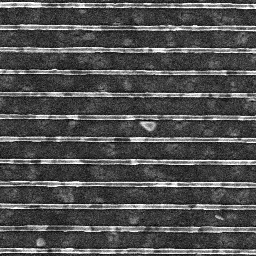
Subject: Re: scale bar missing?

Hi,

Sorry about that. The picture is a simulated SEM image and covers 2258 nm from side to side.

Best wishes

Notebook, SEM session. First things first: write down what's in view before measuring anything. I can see parallel lines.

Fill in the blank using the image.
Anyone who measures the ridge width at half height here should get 33.1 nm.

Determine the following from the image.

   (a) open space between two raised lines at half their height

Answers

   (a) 0.164 microns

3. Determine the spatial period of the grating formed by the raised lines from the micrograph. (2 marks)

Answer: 197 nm